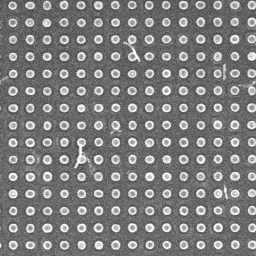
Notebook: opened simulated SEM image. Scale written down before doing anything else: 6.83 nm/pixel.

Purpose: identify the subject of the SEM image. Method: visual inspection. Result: a regular array of raised bodies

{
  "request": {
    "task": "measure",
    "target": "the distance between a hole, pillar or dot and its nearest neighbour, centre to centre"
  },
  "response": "115 nm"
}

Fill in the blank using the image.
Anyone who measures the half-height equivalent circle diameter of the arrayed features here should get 8.07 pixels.